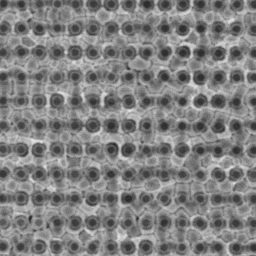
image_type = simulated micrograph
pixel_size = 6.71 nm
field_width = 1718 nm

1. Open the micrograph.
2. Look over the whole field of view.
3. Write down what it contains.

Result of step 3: a regular array of raised bodies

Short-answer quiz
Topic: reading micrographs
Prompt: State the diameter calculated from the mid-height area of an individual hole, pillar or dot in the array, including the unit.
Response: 68.1 nanometers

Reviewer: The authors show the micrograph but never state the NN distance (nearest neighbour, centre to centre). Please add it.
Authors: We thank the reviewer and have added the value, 118 nm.